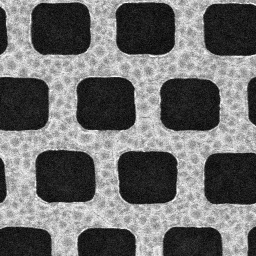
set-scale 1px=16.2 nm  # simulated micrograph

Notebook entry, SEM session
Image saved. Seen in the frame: holes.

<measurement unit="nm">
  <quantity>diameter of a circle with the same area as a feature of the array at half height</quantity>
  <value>988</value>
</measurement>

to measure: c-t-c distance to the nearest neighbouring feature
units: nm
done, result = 1350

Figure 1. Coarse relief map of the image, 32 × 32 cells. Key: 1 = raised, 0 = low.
11111000001111100000011111100000
01110000000111000000001111000000
01110000000111000000001110000000
01110000000111000000001110000000
01110000000111000000001110000000
01110000000111100000001111000000
11111000000111100000011111000000
11111111111111111111111111111111
11111111111111111111111111111111
11111111111111111111111111111111
00000011110000000111000000011110
00000011110000000111000000011110
00000011110000000111000000001110
00000011110000000111000000001110
00000011110000000111000000001110
00000011110000000111000000011111
11111111111111111111111111111111
11111111111111111111111111111111
11111111111111111111111111111111
11111000000111100000001111000000
01110000000011100000001111000000
01110000000011100000001110000000
01110000000011100000001110000000
01110000000011100000001110000000
01111000000011100000001111000000
11111111111111110000111111111100
11111111111111111111111111111111
11111111111111111111111111111111
00001111111000111111100000011111
00000011110000000111100000001110
00000011110000000111000000001110
00000001110000000111000000001110